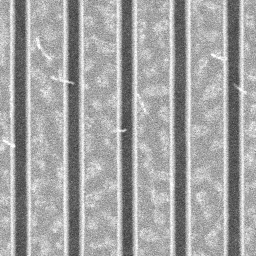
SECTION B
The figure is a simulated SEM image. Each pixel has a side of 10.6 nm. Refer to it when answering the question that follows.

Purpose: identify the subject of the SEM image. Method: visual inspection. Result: parallel lines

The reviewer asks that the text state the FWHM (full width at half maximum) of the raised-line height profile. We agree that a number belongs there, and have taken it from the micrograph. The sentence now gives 414 nm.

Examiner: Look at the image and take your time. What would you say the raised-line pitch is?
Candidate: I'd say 567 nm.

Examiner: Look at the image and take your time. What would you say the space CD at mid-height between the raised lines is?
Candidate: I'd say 156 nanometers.